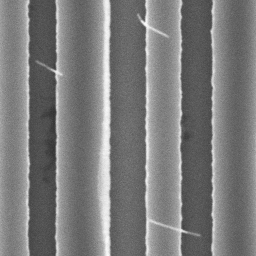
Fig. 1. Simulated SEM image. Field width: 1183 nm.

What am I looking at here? lines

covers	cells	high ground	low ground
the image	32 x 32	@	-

@@@----@@@@@@@----@@@@@----@@@@@
@@@----@@@@@@@----@@@@@----@@@@@
@@@@---@@@@@@@----@@@@@----@@@@@
@@@@---@@@@@@@----@@@@@----@@@@@
@@@@---@@@@@@@----@@@@@----@@@@@
@@@@---@@@@@@-----@@@@@----@@@@@
@@@@---@@@@@@-----@@@@@----@@@@@
@@@@---@@@@@@-----@@@@@----@@@@@
@@@@---@@@@@@-----@@@@@----@@@@@
@@@@---@@@@@@@----@@@@@----@@@@@
@@@@---@@@@@@@----@@@@@----@@@@@
@@@@---@@@@@@-----@@@@@----@@@@@
@@@@---@@@@@@-----@@@@@----@@@@@
@@@@---@@@@@@@----@@@@@----@@@@@
@@@@---@@@@@@@----@@@@@----@@@@@
@@@----@@@@@@@----@@@@@----@@@@@
@@@@---@@@@@@-----@@@@@----@@@@@
@@@@---@@@@@@-----@@@@@----@@@@@
@@@----@@@@@@-----@@@@-----@@@@@
@@@@---@@@@@@-----@@@@@----@@@@@
@@@@---@@@@@@-----@@@@@----@@@@@
@@@@---@@@@@@-----@@@@@----@@@@@
@@@@---@@@@@@-----@@@@@----@@@@@
@@@@---@@@@@@-----@@@@@----@@@@@
@@@----@@@@@@-----@@@@@----@@@@@
@@@----@@@@@@-----@@@@@----@@@@@
@@@@---@@@@@@-----@@@@@----@@@@@
@@@@---@@@@@@-----@@@@@----@@@@@
@@@----@@@@@@-----@@@@@----@@@@@
@@@----@@@@@@-----@@@@@----@@@@@
@@@----@@@@@@@----@@@@@----@@@@@
@@@@---@@@@@@@----@@@@@----@@@@@